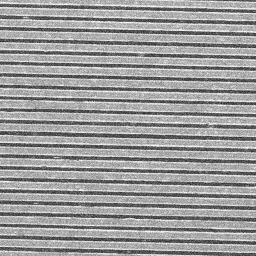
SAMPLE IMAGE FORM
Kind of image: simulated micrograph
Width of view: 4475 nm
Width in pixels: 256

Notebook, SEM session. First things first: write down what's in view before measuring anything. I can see parallel lines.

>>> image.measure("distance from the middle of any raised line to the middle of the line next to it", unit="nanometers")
202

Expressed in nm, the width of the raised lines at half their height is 120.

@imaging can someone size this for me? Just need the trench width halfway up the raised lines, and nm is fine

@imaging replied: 74.3